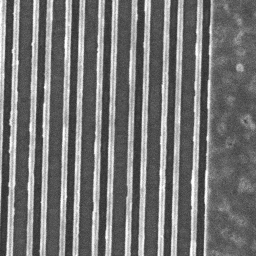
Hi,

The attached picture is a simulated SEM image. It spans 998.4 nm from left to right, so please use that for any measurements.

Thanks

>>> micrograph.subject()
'parallel lines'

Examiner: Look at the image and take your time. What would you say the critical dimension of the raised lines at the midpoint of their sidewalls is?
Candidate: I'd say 20.9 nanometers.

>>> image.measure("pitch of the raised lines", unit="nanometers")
64.9